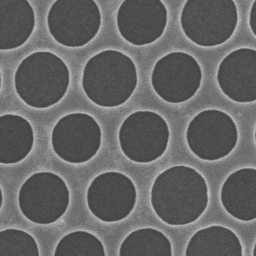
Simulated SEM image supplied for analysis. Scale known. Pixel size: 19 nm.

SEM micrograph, a regular array of holes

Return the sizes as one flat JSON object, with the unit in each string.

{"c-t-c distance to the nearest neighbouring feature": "67.4 px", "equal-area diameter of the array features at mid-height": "975 nm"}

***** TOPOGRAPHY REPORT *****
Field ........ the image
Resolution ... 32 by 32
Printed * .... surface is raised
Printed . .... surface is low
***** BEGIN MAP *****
....***.....***.....***......***
....**......***......**.......*.
....**.......**......**.......*.
....**......***......**......**.
....***.....***.....***......***
...*****...******.*******...****
*****.*******..**************...
***.....***.....****....****....
**......***......**......**.....
**.......*.......**......**.....
**.......*.......**......**.....
**......***......***....****....
***.....***.....****...******...
********************************
..******...*****....****.....***
....***.....***......***.....***
....***......**......**.......**
....**.......**......**.......**
....***.....***......***.....***
...****.....****....*****...****
********************************
*****.**************.....****...
***.....****....***.......**....
***.....***......**.......**....
**.......**......**.......**....
**.......**......**.......**....
***.....***.....***......***....
****...******..*****....******.*
**************************..****
....****....****.....***.....***
.....**......**......**.......**
.....**......**......**.......**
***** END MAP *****